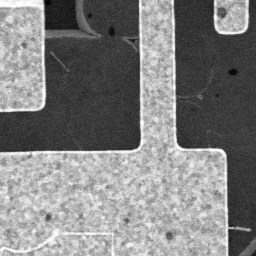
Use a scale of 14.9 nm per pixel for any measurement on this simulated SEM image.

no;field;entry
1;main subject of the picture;wiring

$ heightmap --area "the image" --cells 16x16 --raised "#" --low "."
###......##..##.
###......##..##.
###......##.....
###......##.....
###......##.....
###......##.....
###......##.....
.........##.....
.........##.....
.......#######..
##############..
##############..
##############..
##############..
##############..
##############..